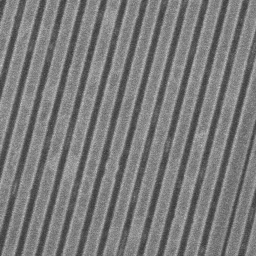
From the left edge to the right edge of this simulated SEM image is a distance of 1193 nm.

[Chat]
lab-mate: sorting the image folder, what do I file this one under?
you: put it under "parallel lines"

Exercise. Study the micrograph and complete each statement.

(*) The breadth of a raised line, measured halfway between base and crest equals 54.1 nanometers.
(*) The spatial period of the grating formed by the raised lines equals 0.0917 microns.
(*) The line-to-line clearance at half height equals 36.1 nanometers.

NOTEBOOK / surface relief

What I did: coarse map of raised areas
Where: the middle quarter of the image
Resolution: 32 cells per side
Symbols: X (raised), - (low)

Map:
--XXX--XXX--XXX--XXX--XXX--XXX--
-XXX--XXXX--XXX--XXX--XXX--XXX--
-XXX--XXX--XXX--XXX--XXXX--XXX--
-XXX--XXX--XXX--XXX--XXX--XXX--X
-XXX--XXX--XXX--XXX--XXX--XXX--X
XXX--XXXX--XXX--XXX--XXX--XXX--X
XXX--XXX--XXX--XXX--XXX--XXXX--X
XXX--XXX--XXX--XXX--XXX--XXX--XX
XXX--XXX--XXX--XXX--XXX--XXX--XX
XX---XXX--XXX--XXX--XXX--XXX--XX
XX--XXX--XXX--XXX--XXXX-XXXX--XX
XX--XXX--XXX--XXX--XXX--XXX--XXX
XX--XXX--XXX--XXX--XXX--XXX--XXX
XX-XXXX-XXXX--XXX--XXX--XXX--XXX
X--XXX--XXX--XXX--XXXX-XXXX--XXX
X--XXX--XXX--XXX--XXX--XXX--XXX-
X--XXX--XXX--XXX--XXX--XXX--XXX-
--XXXX--XXX--XXX--XXX--XXX--XXX-
--XXX--XXX--XXX--XXX--XXXX--XXX-
--XXX--XXX--XXX--XXX--XXX--XXX--
--XXX--XXX--XXX--XXX--XXX--XXX--
-XXXX--XXX--XXX--XXX--XXX--XXX--
-XXX--XXX---XX--XXXX-XXXX--XXX--
-XXX--XXX--XXX--XXX--XXX--XXX--X
-XXX--XXX--XX---XXX--XXX--XXX--X
XXX---XX---XX---XXX--XXX--XXX--X
XXX--XXX---XX--XXX--XXX---XXX--X
XXX--XXX--XXX--XXX--XXX--XXX--XX
XXX--XXX--XX---XXX--XXX--XXX--XX
XX---XX---XX---XXX--XXX--XXX--XX
XX--XXX--XXX--XXX--XXX---XX---XX
XX--XXX--XXX--XXX--XXX--XXX--XXX